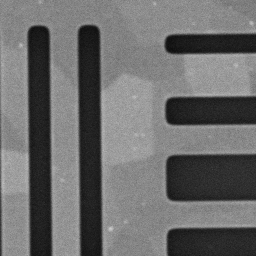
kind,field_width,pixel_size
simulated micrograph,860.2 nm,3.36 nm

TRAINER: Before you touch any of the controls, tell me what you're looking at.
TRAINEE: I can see groups of lines, slits or small figures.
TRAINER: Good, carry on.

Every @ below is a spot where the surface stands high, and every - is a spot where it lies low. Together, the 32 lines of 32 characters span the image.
@@@@@@@@@@@@@@@@@@@@@@@@@@@@@@@@
@@@@@@@@@@@@@@@@@@@@@@@@@@@@@@@@
@@@@@@@@@@@@@@@@@@@@@@@@@@@@@@@@
@@@@--@@@@--@@@@@@@@@@@@@@@@@@@@
@@@---@@@@---@@@@@@@@-----------
@@@---@@@@---@@@@@@@@-----------
@@@---@@@@---@@@@@@@@-----------
@@@---@@@@---@@@@@@@@@@@@@@@@@@@
@@@---@@@@---@@@@@@@@@@@@@@@@@@@
@@@---@@@@---@@@@@@@@@@@@@@@@@@@
@@@---@@@@---@@@@@@@@@@@@@@@@@@@
@@@---@@@@---@@@@@@@@@@@@@@@@@@@
@@@---@@@@---@@@@@@@@-----------
@@@@--@@@@---@@@@@@@@-----------
@@@@--@@@@---@@@@@@@@-----------
@@@@--@@@@---@@@@@@@@-----------
@@@@--@@@@---@@@@@@@@@@@@@@@@@@@
@@@@--@@@@---@@@@@@@@@@@@@@@@@@@
@@@@--@@@@---@@@@@@@@@@@@@@@@@@@
@@@@--@@@@---@@@@@@@@-----------
@@@@--@@@@---@@@@@@@@-----------
@@@@--@@@@---@@@@@@@@-----------
@@@@--@@@@---@@@@@@@@-----------
@@@@--@@@@---@@@@@@@@-----------
@@@@--@@@@---@@@@@@@@-----------
@@@@--@@@@---@@@@@@@@@@@@@@@@@@@
@@@@--@@@@---@@@@@@@@@@@@@@@@@@@
@@@@--@@@@---@@@@@@@@@@@@@@@@@@@
@@@@---@@@---@@@@@@@@@----------
@@@@---@@@---@@@@@@@@-----------
@@@@---@@@---@@@@@@@@-----------
@@@@---@@@---@@@@@@@@-----------